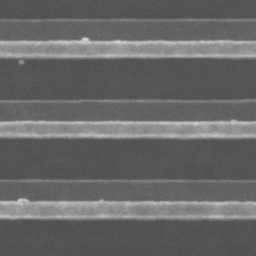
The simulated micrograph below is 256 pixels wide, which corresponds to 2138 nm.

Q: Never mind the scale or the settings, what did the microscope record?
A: lines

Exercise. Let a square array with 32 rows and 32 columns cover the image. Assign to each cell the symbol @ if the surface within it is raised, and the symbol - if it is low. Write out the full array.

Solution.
--------------------------------
--------------------------------
--------------------------------
@@@@@@@@@@@@@@@@@@@@@@@@@@@@@@@@
@@@@@@@@@@@@@@@@@@@@@@@@@@@@@@@@
@@@@@@@@@@@@@@@@@@@@@@@@@@@@@@@@
@@@@@@@@@@@@@@@@@@@@@@@@@@@@@@@@
--------------------------------
--------------------------------
--------------------------------
--------------------------------
--------------------------------
--------------------------------
@@@@@@@@@@@@@@@@@@@@@@@@@@@@@@@@
@@@@@@@@@@@@@@@@@@@@@@@@@@@@@@@@
@@@@@@@@@@@@@@@@@@@@@@@@@@@@@@@@
@@@@@@@@@@@@@@@@@@@@@@@@@@@@@@@@
--------------------------------
--------------------------------
--------------------------------
--------------------------------
--------------------------------
--------------------------------
@@@@@@@@@@@@@@@@@@@@@@@@@@@@@@@@
@@@@@@@@@@@@@@@@@@@@@@@@@@@@@@@@
@@@@@@@@@@@@@@@@@@@@@@@@@@@@@@@@
@@@@@@@@@@@@@@@@@@@@@@@@@@@@@@@@
--------------------------------
--------------------------------
--------------------------------
--------------------------------
--------------------------------